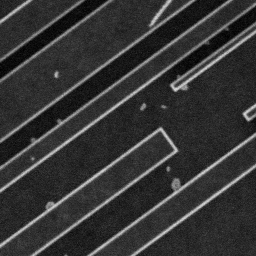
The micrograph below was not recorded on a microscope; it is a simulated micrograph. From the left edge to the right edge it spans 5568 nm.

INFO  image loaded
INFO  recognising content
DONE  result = groups of lines, slits or small figures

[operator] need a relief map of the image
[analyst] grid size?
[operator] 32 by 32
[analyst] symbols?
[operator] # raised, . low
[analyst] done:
...#######...###########....####
..######....##########.....####.
#######...###########....####...
######...##########.....####...#
####....##########.....####...#.
###...###########....####...##..
##...##########.....####...##...
...###########....####....#.....
..###########....####...##......
.##########.....####...#........
##########....####....#.........
#########....####...............
#######.....####................
######....####.................#
####.....####..................#
###.....####....................
##....####.........#............
.....####.........###..........#
...####..........#####........##
..####.........######.......####
.####.........######.......#####
###..........######......######.
##.........######.......######..
#.........######.......#####....
.........#####.......######.....
.......######.......#####.......
......######.......#####........
....######.......######.........
...######.......#####...........
..######.......#####............
######.......######.............
#####.......#####...............